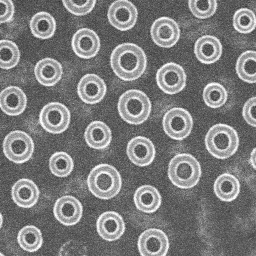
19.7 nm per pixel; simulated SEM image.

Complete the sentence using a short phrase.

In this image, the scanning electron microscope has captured a regular array of ring-shaped raised bodies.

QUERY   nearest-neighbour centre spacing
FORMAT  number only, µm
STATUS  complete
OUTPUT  0.895